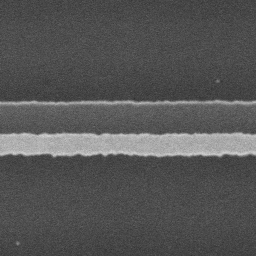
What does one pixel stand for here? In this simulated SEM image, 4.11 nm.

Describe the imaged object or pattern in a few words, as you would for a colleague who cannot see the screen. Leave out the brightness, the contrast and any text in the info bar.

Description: lines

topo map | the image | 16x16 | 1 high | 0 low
0000000000000000
0000000000000000
0000000000000000
0000000000000000
0000000000000000
0000000000000000
1111111111111111
1111111111111111
1111111111111111
1111111111111111
0000000000000000
0000000000000000
0000000000000000
0000000000000000
0000000000000000
0000000000000000